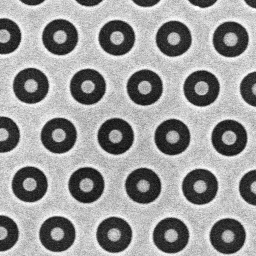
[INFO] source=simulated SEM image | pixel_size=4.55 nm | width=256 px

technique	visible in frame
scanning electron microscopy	an array of small figures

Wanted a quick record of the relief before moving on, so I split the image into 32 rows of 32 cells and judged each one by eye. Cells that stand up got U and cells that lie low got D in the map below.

UUUDDUUUUUDDUUUUUDDDUUUUDDDUUUUD
UUUUUUUUUUUUUUUUUUUUUUUUUUUUUUUU
DDUUUUUDUUUUUUDUUUUUUUUUUUUUUUUU
DDUUUDDDDDUUUDDDDUUUDDDDUUUDDDDU
DDDUUDDDDDUUDDDDDUUDDDDDUUUDDDDU
DDDUUDDDDDUUDDDDDUUDDDDDUUUDDDDU
DDUUUUDDDUUUUDDDUUUUDDDUUUUDDDUU
UUUUUUUUUUUUUUUUUUUUUUUUUUUUUUUU
UUUDUUUUUUUUUUUUUUUUUUUUUUUUUUUU
UUDDDDUUUDDDDUUUDDDDUUUDDDDUUUUD
UUDDDDUUUDDDDUUUDDDDUUUDDDDDUUDD
UUDDDDUUUDDDDUUUDDDDUUUDDDDUUUDD
UUDDDUUUUDDDDUUUDDDDUUUDDDDUUUDD
UUUUUUUUUUUUUUUUUUUUUUUUUUUUUUUU
UUUUUUUUUUUUUUUUUUUUUUUUUUUUUUUU
DDUUUUDDDUUUUDDDUUUUDDDUUUUDDDUU
DDUUUDDDDDUUDDDDDUUDDDDDUUDDDDDU
DDUUUDDDDDUUDDDDDUUDDDDDUUDDDDDU
DDUUUUDDDUUUUDDDUUUUDDDUUUUDDDDU
UUUUUUUUUUUUUUUUUUUUUUUUUUUUDUUU
UUUUUUUUUUUUUUUUUUUUUUUUUUUUUUUU
UUDDDUUUUDDDUUUUDDDUUUUUDDUUUUUD
UDDDDDUUUDDDDUUUDDDDUUUDDDDUUUDD
UDDDDDUUUDDDDUUUDDDDUUUDDDDUUUDD
UUDDDDUUUDDDDUUUDDDDUUUDDDDUUUDD
UUUUUUUUUUUUUUUUUUUUUUUUDDUUUUUD
UUUUUUUUUUUUUUUUUUUUUUUUUUUUUUUU
DDUUUUDDDUUUUDDDUUUUDDDUUUUDDDUU
DDUUUDDDDUUUDDDDUUUDDDDUUUDDDDDU
DDUUUDDDDDUUDDDDDUUDDDDDUUDDDDDU
DDUUUDDDDUUUDDDDUUUDDDDUUUDDDDUU
UUUUUUUDUUUUUDDUUUUUDDUUUUUDDDUU